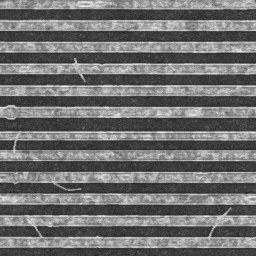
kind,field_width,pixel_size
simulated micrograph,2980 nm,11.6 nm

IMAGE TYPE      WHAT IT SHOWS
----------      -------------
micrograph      parallel lines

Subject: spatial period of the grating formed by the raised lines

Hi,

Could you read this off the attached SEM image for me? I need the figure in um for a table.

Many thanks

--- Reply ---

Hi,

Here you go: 0.252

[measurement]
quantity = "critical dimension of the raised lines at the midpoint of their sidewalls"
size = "110 nm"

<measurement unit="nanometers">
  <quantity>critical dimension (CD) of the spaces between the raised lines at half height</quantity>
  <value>141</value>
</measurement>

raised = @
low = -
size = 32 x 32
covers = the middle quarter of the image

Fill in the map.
@@@@@@@@@@@@@@@@@@@@@@@@@@@@@@@@
@@@@@@@@@@@@@@@@@@@@@@@@@@@@@@@@
---@@---------------------------
--------------------------------
--------------------------------
--------------------------------
@@@@@@@@@@@@@@@@@@@@@@@@@@@@@@@@
@@@@@@@@@@@@@@@@@@@@@@@@@@@@@@@@
--------------------------------
--------------------------------
--------------------------------
@@@@@@@@@@@@@@@@@@@@@@@@@@@@@@@@
@@@@@@@@@@@@@@@@@@@@@@@@@@@@@@@@
--------------------------------
--------------------------------
--------------------------------
--------------------------------
@@@@@@@@@@@@@@@@@@@@@@@@@@@@@@@@
@@@@@@@@@@@@@@@@@@@@@@@@@@@@@@@@
--------------------------------
--------------------------------
--------------------------------
@@@@@@@@@@@@@@@@@@@@@@@@@@@@@@@@
@@@@@@@@@@@@@@@@@@@@@@@@@@@@@@@@
--------------------------------
--------------------------------
--------------------------------
@@@@@@@@@@@@@@@@@@@@@@@@@@@@@@@@
@@@@@@@@@@@@@@@@@@@@@@@@@@@@@@@@
--------------------------------
--------------------------------
--------------------------------